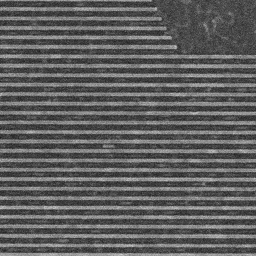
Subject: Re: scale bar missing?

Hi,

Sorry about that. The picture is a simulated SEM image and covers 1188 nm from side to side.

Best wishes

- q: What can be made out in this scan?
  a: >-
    parallel lines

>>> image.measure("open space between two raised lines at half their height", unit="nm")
31.9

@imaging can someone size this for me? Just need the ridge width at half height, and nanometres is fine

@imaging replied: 11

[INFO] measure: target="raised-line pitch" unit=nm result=43.9